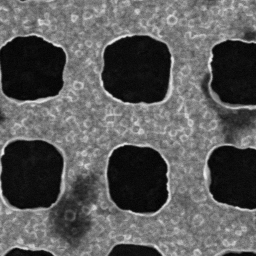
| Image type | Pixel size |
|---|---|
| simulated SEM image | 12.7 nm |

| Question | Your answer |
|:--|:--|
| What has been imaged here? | holes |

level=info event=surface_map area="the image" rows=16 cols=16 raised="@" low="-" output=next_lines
@@@@@@@@@@@@@@@@
@@@@@@@@@@@@@@@@
@--@@@@---@@@@@@
----@@-----@@---
----@@-----@@---
----@@@----@@---
@@@@@@@@@@@@@@--
@@@@@@@@@@@@@@@@
@@@@@@@@@@@@@@@@
----@@@---@@@---
----@@@---@@@---
----@@@---@@@---
---@@@@---@@@@--
@@@@@@@@@@@@@@@@
@@@@@@@@@@@@@@@@
@@@@@@@---@@@@@@